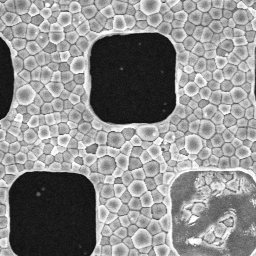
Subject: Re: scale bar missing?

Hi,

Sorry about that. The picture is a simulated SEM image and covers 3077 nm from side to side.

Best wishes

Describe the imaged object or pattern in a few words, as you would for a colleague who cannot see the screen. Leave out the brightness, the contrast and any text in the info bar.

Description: holes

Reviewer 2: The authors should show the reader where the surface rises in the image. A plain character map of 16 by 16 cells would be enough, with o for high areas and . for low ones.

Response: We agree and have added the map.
oooooooooooooooo
oooooooooooooooo
oooooo.....ooooo
.ooooo.....ooooo
.ooooo.....ooooo
.ooooo.....ooooo
.ooooo.....ooooo
oooooo....oooooo
oooooooooooooooo
oooooooooooooooo
oooooooooooooooo
o.....oooooooooo
o.....oooooooooo
o.....oooooooooo
o.....oooooooooo
o.....oooooooooo